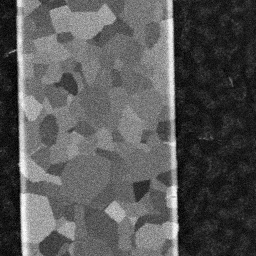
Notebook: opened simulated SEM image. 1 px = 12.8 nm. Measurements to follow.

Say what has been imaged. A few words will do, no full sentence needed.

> one or a few lines or trenches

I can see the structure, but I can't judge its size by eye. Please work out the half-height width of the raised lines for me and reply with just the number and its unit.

1920 nm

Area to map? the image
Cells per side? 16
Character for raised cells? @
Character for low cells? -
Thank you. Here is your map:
-@@@@@@@@@@-----
-@@@@@@@@@@-----
-@@@@@@@@@@-----
-@@@@@@@@@@-----
-@@@@@@@@@@-----
-@@@@@@@@@@-----
-@@@@@@@@@@-----
-@@@@@@@@@@-----
-@@@@@@@@@@-----
-@@@@@@@@@@-----
-@@@@@@@@@@-----
-@@@@@@@@@@-----
-@@@@@@@@@@-----
-@@@@@@@@@@-----
--@@@@@@@@@-----
--@@@@@@@@@-----